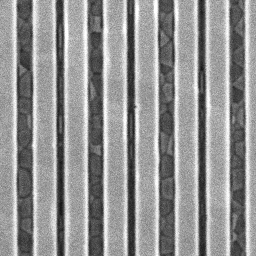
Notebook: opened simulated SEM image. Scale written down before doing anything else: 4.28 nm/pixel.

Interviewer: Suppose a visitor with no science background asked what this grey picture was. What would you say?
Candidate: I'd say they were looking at parallel lines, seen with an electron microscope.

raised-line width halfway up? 94.6 nm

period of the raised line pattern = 148 nanometres